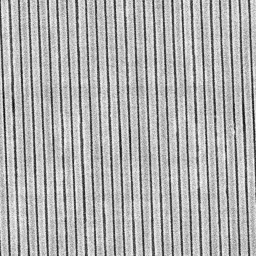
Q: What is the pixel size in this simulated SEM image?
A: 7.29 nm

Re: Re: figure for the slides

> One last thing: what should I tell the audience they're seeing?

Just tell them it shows parallel lines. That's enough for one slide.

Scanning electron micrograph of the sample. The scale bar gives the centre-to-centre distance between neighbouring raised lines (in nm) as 69.9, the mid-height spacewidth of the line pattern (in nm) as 14.6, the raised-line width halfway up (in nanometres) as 51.